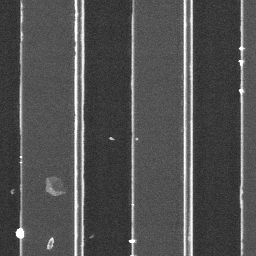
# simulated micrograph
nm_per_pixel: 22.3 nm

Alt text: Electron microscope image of lines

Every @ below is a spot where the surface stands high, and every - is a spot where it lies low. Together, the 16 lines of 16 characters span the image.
-@@@@---@@@@---@
-@@@@---@@@@---@
-@@@@---@@@@---@
-@@@@---@@@@---@
-@@@@---@@@@---@
-@@@@---@@@@---@
-@@@@---@@@@---@
-@@@@---@@@@---@
-@@@@---@@@@---@
-@@@@---@@@@---@
-@@@@---@@@@---@
-@@@@---@@@@---@
-@@@@---@@@@---@
-@@@@---@@@@---@
-@@@@---@@@@---@
-@@@@---@@@@---@